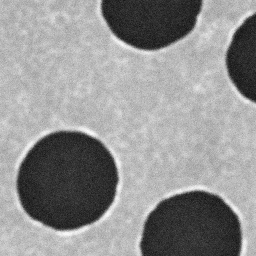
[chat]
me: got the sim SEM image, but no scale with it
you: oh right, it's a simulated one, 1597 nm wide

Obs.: holes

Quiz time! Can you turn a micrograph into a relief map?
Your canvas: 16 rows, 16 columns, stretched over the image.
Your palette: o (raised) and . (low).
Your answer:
oooooo.......ooo
ooooooo.....ooo.
ooooooo....ooo..
oooooooooooooo..
oooooooooooooo..
ooooooooooooooo.
oooooooooooooooo
oooooooooooooooo
ooo...oooooooooo
oo.....ooooooooo
o......ooooooooo
o......ooooooooo
o......ooo....oo
oo....ooo......o
ooooooooo......o
ooooooooo......o